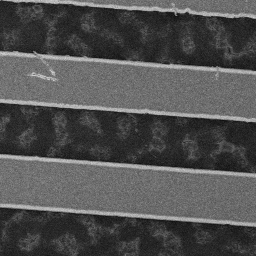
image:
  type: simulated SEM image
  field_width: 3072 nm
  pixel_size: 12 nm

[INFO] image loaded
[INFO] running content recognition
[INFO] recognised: one or a few lines or trenches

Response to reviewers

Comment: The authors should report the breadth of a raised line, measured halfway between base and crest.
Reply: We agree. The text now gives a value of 48 px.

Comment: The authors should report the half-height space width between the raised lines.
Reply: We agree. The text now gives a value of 667 nm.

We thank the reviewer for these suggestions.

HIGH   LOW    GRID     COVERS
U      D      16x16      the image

DDDDDDDDUUUUUUUU
DDDDDDDDDDDDDDDD
DDDDDDDDDDDDDDDD
UUUDDDDDDDDDDDDD
UUUUUUUUUUUUUUUD
UUUUUUUUUUUUUUUU
DDDUUUUUUUUUUUUU
DDDDDDDDDDDDDDDD
DDDDDDDDDDDDDDDD
DDDDDDDDDDDDDDDD
UUUUUUUUUUDDDDDD
UUUUUUUUUUUUUUUU
UUUUUUUUUUUUUUUU
DDDDDDDDDUUUUUUU
DDDDDDDDDDDDDDDD
DDDDDDDDDDDDDDDD